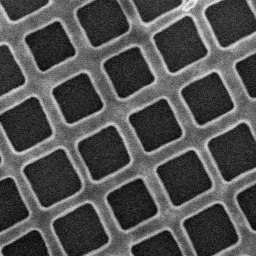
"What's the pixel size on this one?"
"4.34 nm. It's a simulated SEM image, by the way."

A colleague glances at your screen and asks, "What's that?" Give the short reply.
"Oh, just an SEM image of a regular array of holes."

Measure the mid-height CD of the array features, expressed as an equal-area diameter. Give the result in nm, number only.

210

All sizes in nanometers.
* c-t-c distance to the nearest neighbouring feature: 253